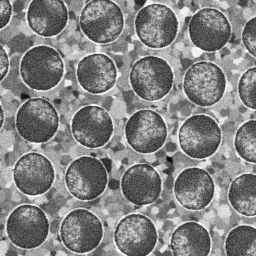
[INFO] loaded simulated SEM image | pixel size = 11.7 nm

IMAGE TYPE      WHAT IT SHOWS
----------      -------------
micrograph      a regular array of holes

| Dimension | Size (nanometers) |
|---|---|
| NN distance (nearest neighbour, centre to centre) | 618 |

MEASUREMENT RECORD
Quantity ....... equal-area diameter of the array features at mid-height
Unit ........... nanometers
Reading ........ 509